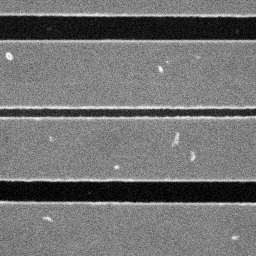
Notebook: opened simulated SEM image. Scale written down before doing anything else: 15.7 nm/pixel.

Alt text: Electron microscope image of lines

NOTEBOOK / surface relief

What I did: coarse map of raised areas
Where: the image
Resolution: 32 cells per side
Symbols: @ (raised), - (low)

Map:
@@@@@@@@@@@@@@@@@@@@@@@@@@@@@@@@
@@@@@@@@@@@@@@@@@@@@@@@@@@@@@@@@
--------------------------------
--------------------------------
--------------------------------
@@@@@@@@@@@@@@@@@@@@@@@@@@@@@@@@
@@@@@@@@@@@@@@@@@@@@@@@@@@@@@@@@
@@@@@@@@@@@@@@@@@@@@@@@@@@@@@@@@
@@@@@@@@@@@@@@@@@@@@@@@@@@@@@@@@
@@@@@@@@@@@@@@@@@@@@@@@@@@@@@@@@
@@@@@@@@@@@@@@@@@@@@@@@@@@@@@@@@
@@@@@@@@@@@@@@@@@@@@@@@@@@@@@@@@
@@@@@@@@@@@@@@@@@@@@@@@@@@@@@@@@
@@@@@@@@@@@@@@@@@@@@@@@@@@@@@@@@
@@@@@@@@@@@@@@@@@@@@@@@@@@@@@@@@
@@@@@@@@@@@@@@@@@@@@@@@@@@@@@@@@
@@@@@@@@@@@@@@@@@@@@@@@@@@@@@@@@
@@@@@@@@@@@@@@@@@@@@@@@@@@@@@@@@
@@@@@@@@@@@@@@@@@@@@@@@@@@@@@@@@
@@@@@@@@@@@@@@@@@@@@@@@@@@@@@@@@
@@@@@@@@@@@@@@@@@@@@@@@@@@@@@@@@
@@@@@@@@@@@@@@@@@@@@@@@@@@@@@@@@
-@-@--@@@@@@@@-@@@@@@@@@@@@@@@@@
--------------------------------
--------------------------------
@@@@@@@@@@@@@@@@@@@@@@@@@@@@@@@@
@@@@@@@@@@@@@@@@@@@@@@@@@@@@@@@@
@@@@@@@@@@@@@@@@@@@@@@@@@@@@@@@@
@@@@@@@@@@@@@@@@@@@@@@@@@@@@@@@@
@@@@@@@@@@@@@@@@@@@@@@@@@@@@@@@@
@@@@@@@@@@@@@@@@@@@@@@@@@@@@@@@@
@@@@@@@@@@@@@@@@@@@@@@@@@@@@@@@@